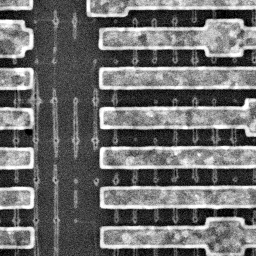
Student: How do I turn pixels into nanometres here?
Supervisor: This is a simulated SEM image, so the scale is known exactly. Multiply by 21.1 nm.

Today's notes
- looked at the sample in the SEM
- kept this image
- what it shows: wiring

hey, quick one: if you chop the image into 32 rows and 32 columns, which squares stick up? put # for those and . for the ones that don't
####.......#####################
...........#####................
................................
###......................######.
####.........###################
####.........###################
###.......................####..
................................
................................
####.........###################
####.........###################
................................
................................
..............................##
####.........###################
####.........###################
...............................#
................................
................................
####.........###################
####.........###################
................................
................................
.......................#########
####.........###################
####.........###################
................................
..........................####..
.......................#.#######
####.........###################
####.........###################
..........................####..